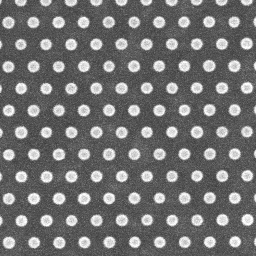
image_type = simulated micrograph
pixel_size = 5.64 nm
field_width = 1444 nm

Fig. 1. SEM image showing a regular array of raised bodies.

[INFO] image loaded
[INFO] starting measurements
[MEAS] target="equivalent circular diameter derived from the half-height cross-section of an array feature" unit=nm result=59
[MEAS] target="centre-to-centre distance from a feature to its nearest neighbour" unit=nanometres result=140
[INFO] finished